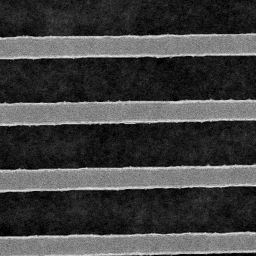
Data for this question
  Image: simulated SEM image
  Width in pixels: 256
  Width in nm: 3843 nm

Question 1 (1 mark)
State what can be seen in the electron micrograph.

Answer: lines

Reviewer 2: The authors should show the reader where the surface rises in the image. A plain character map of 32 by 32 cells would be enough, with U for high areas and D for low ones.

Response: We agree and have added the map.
DDDDDDDDDDDDDDDDDDDDDDDDDDDDDDDD
DDDDDDDDDDDDDDDDDDDDDDDDDDDDDDDD
DDDDDDDDDDDDDDDDDDDDDDDDDDDDDDDD
DDDDDDDDDDDDDDDDDDDDDDDDDDDDDDDD
DDDDDDDDDDDDDUDUUDUUUUUUUUUUUUUU
UUUUUUUUUUUUUUUUUUUUUUUUUUUUUUUU
UUUUUUUUUUUUUUUUUUUUUUUUUUUUUUUU
DDDDDDDDDDDDDDDDDDDDDDDDDDDDDDDD
DDDDDDDDDDDDDDDDDDDDDDDDDDDDDDDD
DDDDDDDDDDDDDDDDDDDDDDDDDDDDDDDD
DDDDDDDDDDDDDDDDDDDDDDDDDDDDDDDD
DDDDDDDDDDDDDDDDDDDDDDDDDDDDDDDD
DDDDDDDDDDDDDDDDDDDDDDDDDDUDUDUU
UUUUUUUUUUUUUUUUUUUUUUUUUUUUUUUU
UUUUUUUUUUUUUUUUUUUUUUUUUUUUUUUU
UUUUUUUUDDDDDDDDDDDDDDDDDDDDDDDD
DDDDDDDDDDDDDDDDDDDDDDDDDDDDDDDD
DDDDDDDDDDDDDDDDDDDDDDDDDDDDDDDD
DDDDDDDDDDDDDDDDDDDDDDDDDDDDDDDD
DDDDDDDDDDDDDDDDDDDDDDDDDDDDDDDD
DDDDDDDDDDDDDDDDDDDDDDDDDDDDDDDD
UUUUUUUUUUUUUUUUUUUUUUUUUUUUUUUU
UUUUUUUUUUUUUUUUUUUUUUUUUUUUUUUU
UUUUUUUUUUUUUUUUUUUUDDDDDDDDDDDD
DDDDDDDDDDDDDDDDDDDDDDDDDDDDDDDD
DDDDDDDDDDDDDDDDDDDDDDDDDDDDDDDD
DDDDDDDDDDDDDDDDDDDDDDDDDDDDDDDD
DDDDDDDDDDDDDDDDDDDDDDDDDDDDDDDD
DDDDDDDDDDDDDDDDDDDDDDDDDDDDDDDD
DDDDDDDDUUUUDUUUUUUUUUUUUUUUUUUU
UUUUUUUUUUUUUUUUUUUUUUUUUUUUUUUU
UUUUUUUUUUUUUUUUUUUUUUUUUUUUUUUU